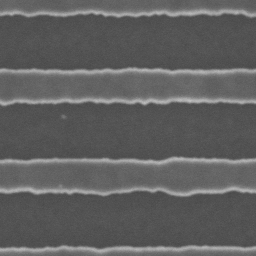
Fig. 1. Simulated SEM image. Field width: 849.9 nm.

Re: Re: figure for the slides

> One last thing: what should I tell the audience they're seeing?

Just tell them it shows lines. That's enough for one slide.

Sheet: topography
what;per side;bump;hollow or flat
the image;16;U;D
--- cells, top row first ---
UUUUUUUUUUUUUUUU
DDDDDDDDDDDDDDDD
DDDDDDDDDDDDDDDD
DDDDDDDDDDDDDDDD
UUUUUUUUUUUUUUUU
UUUUUUUUUUUUUUUU
UDDDDDDDDDDDDDDD
DDDDDDDDDDDDDDDD
DDDDDDDDDDDDDDDD
DDDDDDDDDDDDDDDD
UUUUUUUUUUUUUUUU
UUUUUUUUUUUUUUUU
DDDDDDDDDDDDDDDD
DDDDDDDDDDDDDDDD
DDDDDDDDDDDDDDDD
UUUUUUDUUUUUUUUU